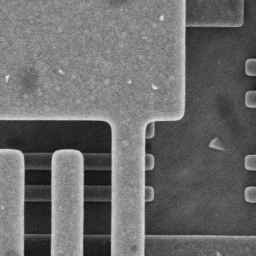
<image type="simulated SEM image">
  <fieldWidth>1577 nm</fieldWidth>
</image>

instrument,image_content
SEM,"wiring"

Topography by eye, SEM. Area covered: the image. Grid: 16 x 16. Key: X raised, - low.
XXXXXXXXXXXX----
XXXXXXXXXXXX----
XXXXXXXXXXXX----
XXXXXXXXXXXX----
XXXXXXXXXXXX----
XXXXXXXXXXXX----
XXXXXXXXXXXX----
-----XXXXXX-----
-------XX-------
X---X--XX-------
XX-XX--XX-------
XX-XX--XX-------
X--XX--XX-------
X--XX--XX-------
X--XX--XX-------
X--XX--XX-------